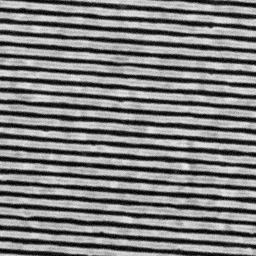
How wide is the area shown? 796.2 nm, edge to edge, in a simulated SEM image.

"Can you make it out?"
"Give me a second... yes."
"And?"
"parallel lines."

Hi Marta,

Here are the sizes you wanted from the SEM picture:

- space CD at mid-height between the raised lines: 20.1 nm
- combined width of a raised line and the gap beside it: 0.0357 micrometres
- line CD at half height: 0.0143 um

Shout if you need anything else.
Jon